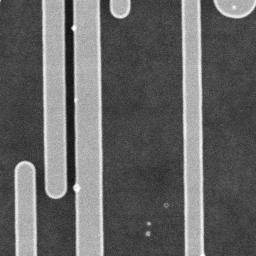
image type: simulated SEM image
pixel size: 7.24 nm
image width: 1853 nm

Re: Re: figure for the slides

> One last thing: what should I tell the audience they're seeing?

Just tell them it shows groups of lines, slits or small figures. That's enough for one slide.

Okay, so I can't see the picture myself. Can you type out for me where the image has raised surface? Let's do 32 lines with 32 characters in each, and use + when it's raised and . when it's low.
.....+++.+++..++.......++..+++++
.....+++.+++..++.......++...+++.
......++.+++...........++.......
......++.+++...........++.......
......++.+++...........++.......
......++.+++...........++.......
......++.+++...........++.......
......++.+++...........++.......
......++.+++...........++.......
......++.+++...........++.......
......++.+++...........++.......
......++.++++..........++.......
......++.++++..........++.......
......++.++++..........++.......
......++.++++..........++.......
......++.++++..........++.......
......++.++++..........++.......
......++.++++..........++.......
......++.++++..........++.......
......++.++++..........++.......
..++..++.++++..........++.......
..++..++.++++..........++.......
..++..++.++++..........++.......
..++..++.++++..........++.......
..++..++..+++..........++.......
..++......+++..........++.......
..++......+++..........++.......
..++......+++..........++.......
..++......+++..........++.......
..++......+++..........++.......
..++......+++..........++.......
..+++.....+++..........++.......